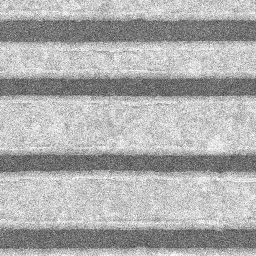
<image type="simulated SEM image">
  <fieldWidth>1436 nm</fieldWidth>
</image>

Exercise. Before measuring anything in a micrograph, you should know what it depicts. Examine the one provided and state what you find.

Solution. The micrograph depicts one or a few lines or trenches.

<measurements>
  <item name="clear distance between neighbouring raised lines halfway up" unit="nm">151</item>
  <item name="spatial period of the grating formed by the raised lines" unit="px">70.1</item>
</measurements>